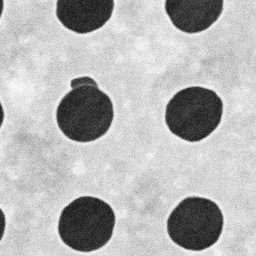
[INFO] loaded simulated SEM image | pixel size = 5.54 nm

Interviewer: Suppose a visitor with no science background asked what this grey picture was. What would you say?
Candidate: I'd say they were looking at holes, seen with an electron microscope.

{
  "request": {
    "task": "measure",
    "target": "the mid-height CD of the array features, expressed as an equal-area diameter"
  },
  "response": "314 nm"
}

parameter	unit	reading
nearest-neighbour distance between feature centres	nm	604